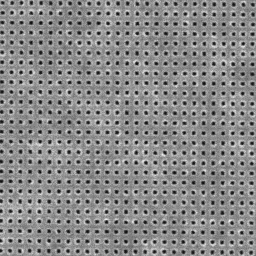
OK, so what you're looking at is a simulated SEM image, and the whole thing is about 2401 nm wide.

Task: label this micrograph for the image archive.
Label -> a regular array of holes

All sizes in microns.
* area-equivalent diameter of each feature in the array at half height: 0.041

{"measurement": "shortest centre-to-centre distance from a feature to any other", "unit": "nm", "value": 86.4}